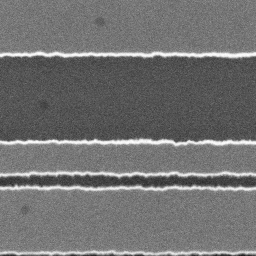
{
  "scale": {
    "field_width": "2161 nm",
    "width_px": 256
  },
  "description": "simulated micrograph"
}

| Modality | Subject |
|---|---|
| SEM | lines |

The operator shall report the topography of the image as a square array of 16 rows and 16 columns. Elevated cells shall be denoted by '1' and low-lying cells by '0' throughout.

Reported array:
1111111111111111
1111111111111111
1111111111111111
0000000000000000
0000000000000000
0000000000000000
0000000000000000
0000000000000000
0000000000000000
1111111111111111
1111111111111111
1111111111111111
1111111111111111
1111111111111111
1111111111111111
1111111111111111